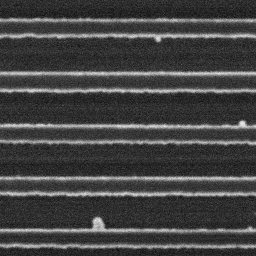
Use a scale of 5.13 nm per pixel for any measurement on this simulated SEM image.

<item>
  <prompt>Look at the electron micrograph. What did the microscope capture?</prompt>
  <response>lines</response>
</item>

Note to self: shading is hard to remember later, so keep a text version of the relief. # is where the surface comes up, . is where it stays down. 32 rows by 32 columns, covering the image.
................................
................................
################################
################################
###.#########.##################
................................
................................
................................
................................
################################
################################
....................#...........
................................
................................
................................
................................
################################
################################
................................
................................
................................
................................
################################
################################
................................
................................
................................
................................
............#...................
################################
################################
................................